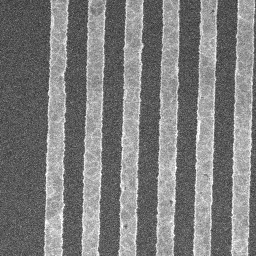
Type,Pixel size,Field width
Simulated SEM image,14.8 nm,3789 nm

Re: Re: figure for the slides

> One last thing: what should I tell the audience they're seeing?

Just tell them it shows parallel lines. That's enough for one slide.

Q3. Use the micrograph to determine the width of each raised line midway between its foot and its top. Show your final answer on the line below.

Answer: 237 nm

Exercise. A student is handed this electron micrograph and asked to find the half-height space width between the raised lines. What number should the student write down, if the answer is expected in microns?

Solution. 0.314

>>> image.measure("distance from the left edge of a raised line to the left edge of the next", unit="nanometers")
553